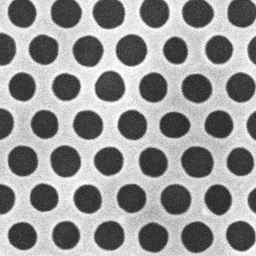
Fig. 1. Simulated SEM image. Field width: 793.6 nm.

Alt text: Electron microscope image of a regular array of holes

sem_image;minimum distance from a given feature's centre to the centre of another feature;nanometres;131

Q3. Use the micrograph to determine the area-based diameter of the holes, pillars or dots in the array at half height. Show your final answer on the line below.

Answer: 0.0927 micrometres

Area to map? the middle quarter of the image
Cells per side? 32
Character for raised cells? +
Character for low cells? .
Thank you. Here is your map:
++++....++++++++..++++++++++++++
+++++++++++.++++++++++++++++++++
..+++++++.....+++++++...++++++++
...+++++.......++++......+++++..
....++++.......++++.......++++..
....+++........++++.......+++...
....+++.........+++.......+++...
....++++.......++++.......++++..
...++++++.....++++++.....+++++..
.+++++++++...++++++++...++++++++
++++++++++++++++++++++++++++++++
+++++..+++++++++..++++++++++++++
+++.....++++++......+++++.....++
+++......+++++......++++.......+
++........+++........+++.......+
++........+++........+++........
++........+++........+++.......+
+++......+++++......+++++......+
++++....+++++++....++++++++.++++
++++++++++++++++++++++++++++++++
.+++++++++++++++++++++++++++++++
...++++++.....++++++....+++++++.
....++++.......++++......+++++..
....+++........++++.......+++...
....+++........+++........+++...
....++++.......++++.......+++...
....++++......+++++.......++++..
...++++++....+++++++.....++++++.
++++++++++++++++++++++.+++++++++
++++++++++++++++++++++++++++++++
++++....+++++++....+++++++....++
+++......+++++......+++++......+